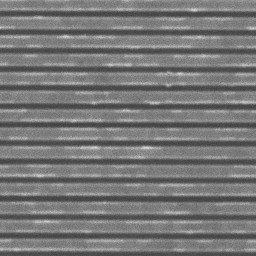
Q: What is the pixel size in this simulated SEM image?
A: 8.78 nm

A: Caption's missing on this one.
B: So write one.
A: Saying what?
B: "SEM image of parallel lines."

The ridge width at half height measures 99.8 nanometers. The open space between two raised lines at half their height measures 58.1 nm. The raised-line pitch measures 0.162 µm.